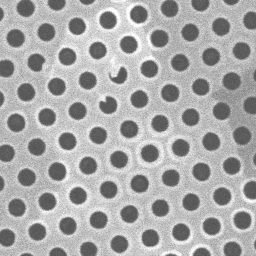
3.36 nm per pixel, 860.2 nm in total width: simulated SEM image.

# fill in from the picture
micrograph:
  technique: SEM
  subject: a regular array of holes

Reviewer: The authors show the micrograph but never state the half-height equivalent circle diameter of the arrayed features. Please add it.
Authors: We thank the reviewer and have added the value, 59.3 nm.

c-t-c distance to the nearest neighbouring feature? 0.105 um